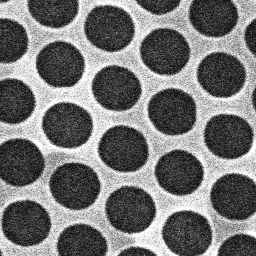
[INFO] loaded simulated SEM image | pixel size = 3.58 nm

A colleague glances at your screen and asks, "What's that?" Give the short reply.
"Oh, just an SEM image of a regular array of holes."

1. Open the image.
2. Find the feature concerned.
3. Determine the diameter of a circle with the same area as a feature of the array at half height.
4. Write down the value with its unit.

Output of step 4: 0.177 µm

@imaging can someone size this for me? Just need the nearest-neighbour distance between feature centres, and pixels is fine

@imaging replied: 60.7